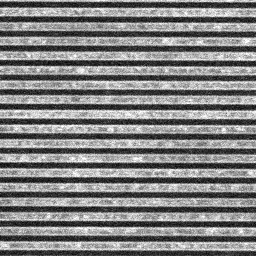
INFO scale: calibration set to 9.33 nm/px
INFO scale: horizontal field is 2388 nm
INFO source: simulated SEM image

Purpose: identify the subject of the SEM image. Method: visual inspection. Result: parallel lines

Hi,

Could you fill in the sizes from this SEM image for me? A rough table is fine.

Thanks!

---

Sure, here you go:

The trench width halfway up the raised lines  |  65.3 nm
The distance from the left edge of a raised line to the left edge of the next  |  136 nm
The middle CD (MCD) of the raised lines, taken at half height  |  73.5 nanometers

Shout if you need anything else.